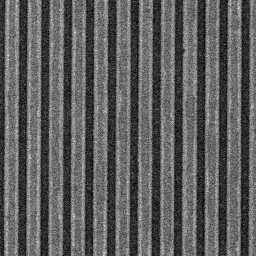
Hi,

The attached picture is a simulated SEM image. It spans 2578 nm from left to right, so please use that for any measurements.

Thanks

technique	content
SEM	parallel lines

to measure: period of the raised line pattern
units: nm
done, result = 224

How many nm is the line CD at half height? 111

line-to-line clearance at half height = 111 nanometers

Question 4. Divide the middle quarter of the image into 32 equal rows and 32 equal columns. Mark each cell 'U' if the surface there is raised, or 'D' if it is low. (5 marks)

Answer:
DDUUUDDDUUDDDDUUDDDUUUDDDUUDDDUU
DDUUUDDDUUDDDDUUDDDUUUDDDUUDDDUU
DDUUUDDDUUDDDDUUDDDUUUDDDUUDDDUU
DDUUUDDDUUDDDDUUDDDUUUDDDUUDDDUU
DDUUUDDDUUDDDDUUDDDUUUDDDUUDDDUU
DDUUUDDDUUDDDDUUDDDUUUDDDUUDDDUU
DDUUUDDDUUDDDDUUDDDUUUDDDUUDDDUU
DDUUUDDDUUDDDDUUDDDUUUDDDUUDDDUU
DDUUUDDDUUDDDDUUDDDUUUDDDUUDDDUU
DDUUUDDDUUDDDDUUDDDUUUDDDUUDDDUU
DDUUUDDDUUDDDDUUDDDUUUDDDUUDDDUU
DDUUUDDDUUDDDDUUDDDUUUDDDUUDDDUU
DDUUUDDDUUDDDDUUDDDUUUDDDUUDDDUU
DDUUUDDDUUDDDDUUDDDUUUDDDUUDDDUU
DDUUUDDDUUDDDDUUDDDUUUDDDUUDDDUU
DDUUUDDDUUDDDDUUDDDUUUDDDUUDDDUU
DDUUUDDDUUDDDUUUDDDUUUDDDUUDDDUU
DDUUUDDDUUDDDUUUDDDUUUDDDUUDDDUU
DDUUUDDDUUDDDUUUDDDUUUDDDUUDDDUU
DDUUUDDDUUDDDUUUDDDUUUDDDUUDDDUU
DDUUUDDDUUDDDUUUDDDUUUDDDUUDDDUU
DDUUUDDDUUDDDUUUDDDUUUDDDUUDDDUU
DDUUUDDDUUDDDUUUDDDUUUDDDUUDDDUU
DDUUUDDDUUDDDUUUDDDUUUDDDUUDDDUU
DDUUUDDDUUDDDUUUDDDUUUDDDUUDDDUU
DDUUUDDDUUDDDUUUDDDUUUDDDUUDDDUU
DDUUUDDDUUDDDUUUDDDUUUDDDUUDDDUU
DDUUUDDDUUDDDUUUDDDUUUDDDUUDDDUU
DDUUUDDDUUDDDUUUDDDUUUDDDUUDDDUU
DDUUUDDDUUDDDDUUDDDUUUDDDUUDDDUU
DDUUUDDDUUDDDDUUDDDUUUDDUUUDDDUU
DDUUUDDDUUDDDDUUDDDUUUDDUUUDDDUU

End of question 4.